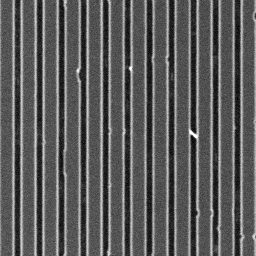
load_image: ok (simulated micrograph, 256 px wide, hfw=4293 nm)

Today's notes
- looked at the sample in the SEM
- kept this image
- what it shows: parallel lines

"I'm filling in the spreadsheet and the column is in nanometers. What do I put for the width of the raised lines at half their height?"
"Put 235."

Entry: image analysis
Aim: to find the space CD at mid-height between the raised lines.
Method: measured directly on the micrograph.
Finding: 134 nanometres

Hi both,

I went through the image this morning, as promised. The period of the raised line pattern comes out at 369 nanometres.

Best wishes